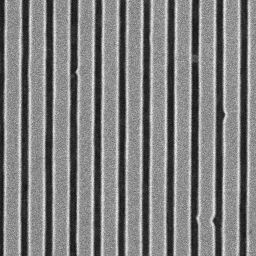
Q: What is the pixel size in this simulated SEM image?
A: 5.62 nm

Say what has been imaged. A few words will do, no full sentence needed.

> parallel lines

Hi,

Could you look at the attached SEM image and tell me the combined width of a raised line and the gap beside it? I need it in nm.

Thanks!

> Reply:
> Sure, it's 136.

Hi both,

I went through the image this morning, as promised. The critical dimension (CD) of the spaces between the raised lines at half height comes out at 42.1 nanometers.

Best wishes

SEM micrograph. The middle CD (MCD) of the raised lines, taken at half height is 95.5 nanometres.